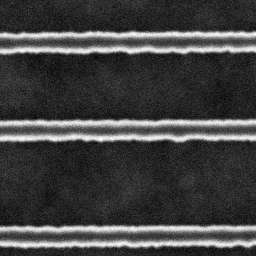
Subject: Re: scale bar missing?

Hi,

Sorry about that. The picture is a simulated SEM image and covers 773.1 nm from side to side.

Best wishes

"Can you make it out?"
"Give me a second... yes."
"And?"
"lines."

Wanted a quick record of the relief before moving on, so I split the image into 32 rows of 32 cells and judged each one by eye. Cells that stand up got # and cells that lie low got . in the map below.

................................
................................
................................
................................
################################
################################
##..#..####.....##.##.#.........
................................
................................
................................
................................
................................
................................
................................
................................
################################
################################
#.#....#....#.........#.........
................................
................................
................................
................................
................................
................................
................................
................................
................................
................................
#######.########################
################################
################################
................................